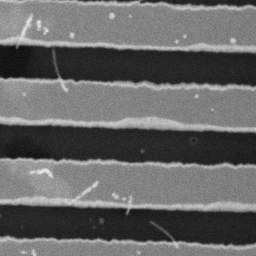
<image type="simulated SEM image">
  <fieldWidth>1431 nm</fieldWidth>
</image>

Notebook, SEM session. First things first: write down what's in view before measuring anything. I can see lines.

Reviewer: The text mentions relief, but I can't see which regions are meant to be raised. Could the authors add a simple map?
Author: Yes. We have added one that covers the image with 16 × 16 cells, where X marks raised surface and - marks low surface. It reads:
XXXXXXXXXXXXXXXX
XXXXXXXXXXXXXXXX
XXXXXXXXXXXXXXXX
----------------
----------------
XXXXXXXXXXXXXXXX
XXXXXXXXXXXXXXXX
XXXXXXXXXXXXXXXX
----------------
----------------
XXXXXXXXXXXXXXXX
XXXXXXXXXXXXXXXX
XXXXXXXXXXXXXXXX
----------------
----------------
XXXXXXXXXXXXXXXX